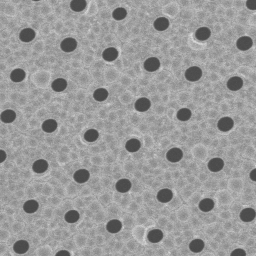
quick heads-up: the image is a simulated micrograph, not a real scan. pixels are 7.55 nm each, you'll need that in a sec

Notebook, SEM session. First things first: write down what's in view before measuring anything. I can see a regular array of holes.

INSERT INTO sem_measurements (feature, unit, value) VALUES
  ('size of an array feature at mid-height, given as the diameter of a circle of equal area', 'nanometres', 112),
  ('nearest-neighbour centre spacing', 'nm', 313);